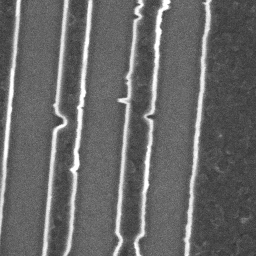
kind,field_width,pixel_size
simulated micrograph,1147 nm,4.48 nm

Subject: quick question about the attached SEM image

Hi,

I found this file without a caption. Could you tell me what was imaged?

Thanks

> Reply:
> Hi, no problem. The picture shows one or a few lines or trenches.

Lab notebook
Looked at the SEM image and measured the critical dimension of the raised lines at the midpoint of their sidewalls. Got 117 nm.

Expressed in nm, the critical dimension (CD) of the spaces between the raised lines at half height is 201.